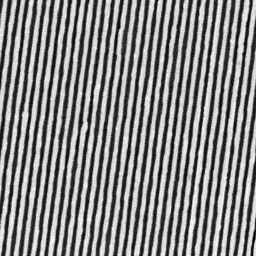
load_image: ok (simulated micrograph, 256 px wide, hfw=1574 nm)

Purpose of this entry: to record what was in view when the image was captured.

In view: parallel lines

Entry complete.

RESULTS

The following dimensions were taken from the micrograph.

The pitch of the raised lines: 52.5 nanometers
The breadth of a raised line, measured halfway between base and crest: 28.2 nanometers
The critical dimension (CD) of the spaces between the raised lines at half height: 3.72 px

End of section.